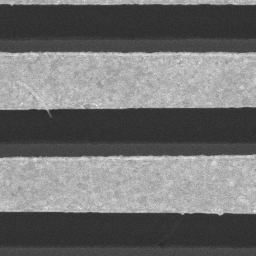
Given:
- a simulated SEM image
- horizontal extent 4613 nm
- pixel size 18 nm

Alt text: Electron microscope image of lines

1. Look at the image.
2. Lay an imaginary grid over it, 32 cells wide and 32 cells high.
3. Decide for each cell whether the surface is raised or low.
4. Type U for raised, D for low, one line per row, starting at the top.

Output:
DUUUUUUUUUUUUUUUUUUDUUUUUDUUUUUU
DDDDDDDDDDDDDDDDDDDDDDDDDDDDDDDD
DDDDDDDDDDDDDDDDDDDDDDDDDDDDDDDD
DDDDDDDDDDDDDDDDDDDDDDDDDDDDDDDD
DDDDDDDDDDDDDDDDDDDDDDDDDDDDDDDD
DDDDDDDDDDDDDDDDDDDDDDDDDDDDDDDD
DDDDDDDDDDDDDDDDDDDDDDDDDDDDDDDD
UUUUUUUUUUUUUUUUUUUUUUUUUUUUUUUU
UUUUUUUUUUUUUUUUUUUUUUUUUUUUUUUU
UUUUUUUUUUUUUUUUUUUUUUUUUUUUUUUU
UUUUUUUUUUUUUUUUUUUUUUUUUUUUUUUU
UUUUUUUUUUUUUUUUUUUUUUUUUUUUUUUU
UUUUUUUUUUUUUUUUUUUUUUUUUUUUUUUU
UUUUUUUUUUUUUUUUDUDDDDDDDDDDDDDD
DDDDDDDDDDDDDDDDDDDDDDDDDDDDDDDD
DDDDDDDDDDDDDDDDDDDDDDDDDDDDDDDD
DDDDDDDDDDDDDDDDDDDDDDDDDDDDDDDD
DDDDDDDDDDDDDDDDDDDDDDDDDDDDDDDD
DDDDDDDDDDDDDDDDDDDDDDDDDDDDDDDD
DDDDDDDDDDDDDDDDDDUDUDUDUUUUUUUU
UUUUUUUUUUUUUUUUUUUUUUUUUUUUUUUU
UUUUUUUUUUUUUUUUUUUUUUUUUUUUUUUU
UUUUUUUUUUUUUUUUUUUUUUUUUUUUUUUU
UUUUUUUUUUUUUUUUUUUUUUUUUUUUUUUU
UUUUUUUUUUUUUUUUUUUUUUUUUUUUUUUU
UUUUUUUUUUUUUUUUUUUUUUUUUUUUUUUU
DDDDDDDDUUUUUUUUUUUUUUUUUUUUUUUU
DDDDDDDDDDDDDDDDDDDDDDDDDDDDDDDD
DDDDDDDDDDDDDDDDDDDDDDDDDDDDDDDD
DDDDDDDDDDDDDDDDDDDDDDDDDDDDDDDD
DDDDDDDDDDDDDDDDDDDDDDDDDDDDDDDD
DDDDDDDDDDDDDDDDDDDDDDDDDDDDDDDD